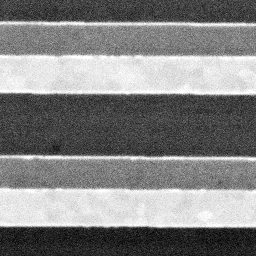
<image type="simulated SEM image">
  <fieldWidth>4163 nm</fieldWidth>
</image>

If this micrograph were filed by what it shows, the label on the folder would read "lines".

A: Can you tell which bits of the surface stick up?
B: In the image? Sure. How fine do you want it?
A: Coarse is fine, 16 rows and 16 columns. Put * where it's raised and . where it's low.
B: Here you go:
................
***.*...........
****************
****************
****************
****************
................
................
................
................
****************
****************
****************
****************
................
................